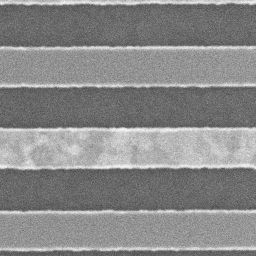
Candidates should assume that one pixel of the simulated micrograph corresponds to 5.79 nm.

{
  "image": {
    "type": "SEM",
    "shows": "lines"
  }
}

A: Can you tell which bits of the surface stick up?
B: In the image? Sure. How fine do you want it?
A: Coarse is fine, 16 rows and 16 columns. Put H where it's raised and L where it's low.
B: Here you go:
LLLLLLLLLLLLLLLL
LLLLLLLLLLLLLLLL
LLLLLLLLLLLLLLLL
HHHHHHHHHHHHHHHH
HHHHHHHHHHHHHHHH
LLLLLLLLLLLLLLLL
LLLLLLLLLLLLLLLL
LLLLLLLLLLLLLLLL
HHHHHHHHHHHHHHHH
HHHHHHHHHHHHHHHH
HHHHHHHHHHLLLLLL
LLLLLLLLLLLLLLLL
LLLLLLLLLLLLLLLL
HHHHHHHHHHHHHHHH
HHHHHHHHHHHHHHHH
HHHHHHHHHHHHHHHH